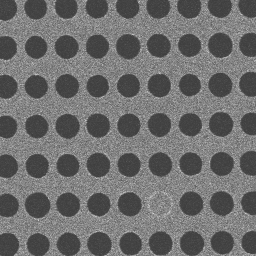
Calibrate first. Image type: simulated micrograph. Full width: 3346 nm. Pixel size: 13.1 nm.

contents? a regular array of holes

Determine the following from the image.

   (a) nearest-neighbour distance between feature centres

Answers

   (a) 30.6 px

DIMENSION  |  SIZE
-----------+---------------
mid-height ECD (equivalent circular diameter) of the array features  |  311 nanometers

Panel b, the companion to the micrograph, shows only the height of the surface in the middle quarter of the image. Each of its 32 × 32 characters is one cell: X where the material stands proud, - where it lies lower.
XXXXXXXXXXXXXXXXXXXXXXXXXXXXXXXX
XXXXXXXXXXXXXXXXXXXXXXXXXXXXXXXX
XXXXXXXXXXXXXXXX-XXXXXX-XXXXXXX-
---XXX----XXXX----XXX-----XXX---
----XX-----XX------XX------XX---
----X------XX------XX------XX---
----XX-----XX------XX------XX---
---XXX-----XXX----XXXX----XXXX--
--XXXXXX-XXXXXXXXXXXXXXXXXXXXXXX
XXXXXXXXXXXXXXXXXXXXXXXXXXXXXXXX
XXXXXXXXXXXXXXXXXXXXXXXXXXXXXXXX
XXXXXXXXXXXXXXXXXXXXXXXXXXXXXXXX
-XXXXXX--XXXXXX--XXXXXX--XXXXX--
---XXX-----XXX-----XXX----XXX---
----X------XX------XX------XX---
----XX------X------XX------XX---
----XX-----XX------XX-----XXX---
---XXX-----XXX----XXXX----XXXX--
--XXXXXX-XXXXXXXXXXXXXXXXXXXXXXX
XXXXXXXXXXXXXXXXXXXXXXXXXXXXXXXX
XXXXXXXXXXXXXXXXXXXXXXXXXXXXXXXX
XXXXXXXXXXXXXXXXXXXXXXXXXXXXXXXX
-XXXXXX---XXXXX--XXXXXX--XXXXX--
---XXX-----XXX----XXX------XX---
----XX-----XXX-----XX------XX---
----XX------X------XX------XX---
----XX-----XXX-----XX------XX---
---XXXX----XXX----XXXX----XXXX--
XXXXXXXXXXXXXXXXXXXXXXXXXXXXXXXX
XXXXXXXXXXXXXXXXXXXXXXXXXXXXXXXX
XXXXXXXXXXXXXXXXXXXXXXXXXXXXXXXX
XXXXXXXXXXXXXXXXXXXXXXXXXXXXXXXX